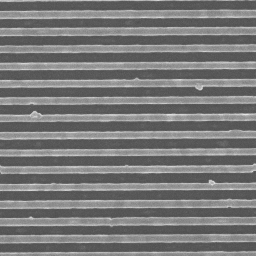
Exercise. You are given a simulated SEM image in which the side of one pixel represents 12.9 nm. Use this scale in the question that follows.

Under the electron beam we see parallel lines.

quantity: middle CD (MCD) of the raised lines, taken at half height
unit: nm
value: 90.2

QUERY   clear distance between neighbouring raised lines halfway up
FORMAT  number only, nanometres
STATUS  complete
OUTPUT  129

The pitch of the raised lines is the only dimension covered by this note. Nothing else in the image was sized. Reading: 0.223 um